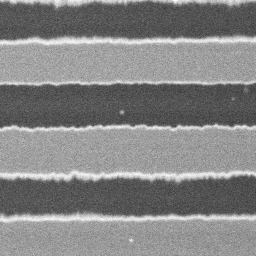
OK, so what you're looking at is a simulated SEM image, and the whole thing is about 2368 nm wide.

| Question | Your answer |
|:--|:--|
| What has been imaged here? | lines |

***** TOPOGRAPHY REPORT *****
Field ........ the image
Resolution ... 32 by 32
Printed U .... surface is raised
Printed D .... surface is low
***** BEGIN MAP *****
DDDDDDDDDDDDDDDDDDDDDDDDDDDDDDDD
DDDDDDDDDDDDDDDDDDDDDDDDDDDDDDDD
DDDDDDDDDDDDDDDDDDDDDDDDDDDDDDDD
DDDDDDDDDDDDDDDDDDDDDDDDDDDDDDDD
DDDDDDDDDDDDDDDDDDDDDDDDDDDDDDDD
UUUUUUUUUUUUUUUUUUUUUUUUUUUUUUUU
UUUUUUUUUUUUUUUUUUUUUUUUUUUUUUUU
UUUUUUUUUUUUUUUUUUUUUUUUUUUUUUUU
UUUUUUUUUUUUUUUUUUUUUUUUUUUUUUUU
UUUUUUUUUUUUUUUUUUUUUUUUUUUUUUUU
DDUDUDUUDDDDDDDDDDDDDDDDDDDDDDDD
DDDDDDDDDDDDDDDDDDDDDDDDDDDDDDDD
DDDDDDDDDDDDDDDDDDDDDDDDDDDDDDDD
DDDDDDDDDDDDDDDDDDDDDDDDDDDDDDDD
DDDDDDDDDDDDDDDDDDDDDDDDDDDDDDDD
DDDDDDDDDDDDDDDDDDDDDDDDDDDDDDDD
UUUUUUUUUUUUUUUUUUUUUUUUUUUUUUUU
UUUUUUUUUUUUUUUUUUUUUUUUUUUUUUUU
UUUUUUUUUUUUUUUUUUUUUUUUUUUUUUUU
UUUUUUUUUUUUUUUUUUUUUUUUUUUUUUUU
UUUUUUUUUUUUUUUUUUUUUUUUUUUUUUUU
UUUUUUUUUUUUUUUUUUUUUUUUUUUUUUUU
DDDDDDDDDDDDDDDDDDDDDDDDDDDDDDDD
DDDDDDDDDDDDDDDDDDDDDDDDDDDDDDDD
DDDDDDDDDDDDDDDDDDDDDDDDDDDDDDDD
DDDDDDDDDDDDDDDDDDDDDDDDDDDDDDDD
DDDDDDDDDDDDDDDDDDDDDDDDDDDDDDDD
UUUUUUUUUUUUUUUUUUUUUUUUUUUUUUUU
UUUUUUUUUUUUUUUUUUUUUUUUUUUUUUUU
UUUUUUUUUUUUUUUUUUUUUUUUUUUUUUUU
UUUUUUUUUUUUUUUUUUUUUUUUUUUUUUUU
UUUUUUUUUUUUUUUUUUUUUUUUUUUUUUUU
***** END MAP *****